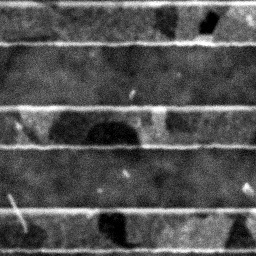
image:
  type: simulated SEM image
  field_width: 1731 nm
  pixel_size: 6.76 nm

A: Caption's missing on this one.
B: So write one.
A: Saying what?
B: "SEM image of lines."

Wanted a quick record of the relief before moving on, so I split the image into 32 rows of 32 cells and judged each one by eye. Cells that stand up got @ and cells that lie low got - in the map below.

----------------------@@@@@@@@@@
@@@@@@@@@@@@@@@@@@@@@@@@@@@@@@@@
@@@@@@@@@@@@@@@@@@@@@@@@@@@@@@@@
@@@@@@@@@@@@@@@@@@@@@@@@@@@@@@@@
@@@@@@@@@@@@@@@@@@@@@@@@@@@@@@@@
@@-@@---@@@-@@@@--@@------@@@@@@
--------------------------------
--------------------------------
--------------------------------
--------------------------------
--------------------------------
--------------------------------
--------------------------------
--------------------------------
@@@@@@@@@@@@@@@@@@@@@@@@@@@@@@@@
@@@@@@@@@@@@@@@@@@@@@@@@@@@@@@@@
@@@@@@@@@@@@@@@@@@@@@@@@@@@@@@@@
@@@@@@@@@@@@@@@@@@@@@@@@@@@@@@@@
----@@@---@--@--@----@---------@
--------------------------------
--------------------------------
--------------------------------
--------------------------------
--------------------------------
--------------------------------
--------------------------------
@@@@@@@@@@@@@@@@@@@@@@@@@@@@@@@@
@@@@@@@@@@@@@@@@@@@@@@@@@@@@@@@@
@@@@@@@@@@@@@@@@@@@@@@@@@@@@@@@@
@@@@@@@@@@@@@@@@@@@@@@@@@@@@@@@@
@@@@@@@@@@@@@@@@@@@@@@@@@@@@@@@@
--------------------------------